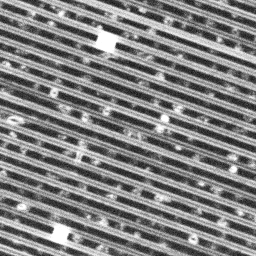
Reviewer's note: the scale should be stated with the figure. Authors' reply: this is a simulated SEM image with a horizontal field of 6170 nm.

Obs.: parallel lines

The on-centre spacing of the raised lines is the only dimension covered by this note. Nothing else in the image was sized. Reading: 315 nm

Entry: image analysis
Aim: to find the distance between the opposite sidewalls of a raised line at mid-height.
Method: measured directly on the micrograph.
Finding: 9.31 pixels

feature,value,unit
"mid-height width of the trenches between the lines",102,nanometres